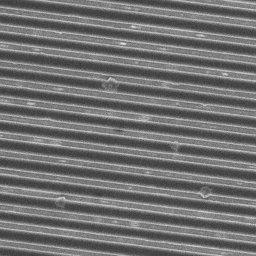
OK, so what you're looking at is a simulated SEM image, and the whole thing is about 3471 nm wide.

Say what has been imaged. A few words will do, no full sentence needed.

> parallel lines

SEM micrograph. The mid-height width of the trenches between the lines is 74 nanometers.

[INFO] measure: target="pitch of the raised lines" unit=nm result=241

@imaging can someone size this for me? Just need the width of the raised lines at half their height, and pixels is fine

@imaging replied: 12.5